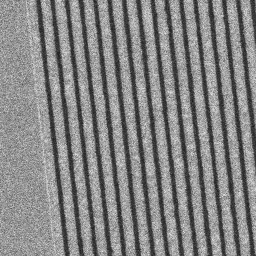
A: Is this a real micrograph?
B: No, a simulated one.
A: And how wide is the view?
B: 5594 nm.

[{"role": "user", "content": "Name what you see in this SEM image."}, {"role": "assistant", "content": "parallel lines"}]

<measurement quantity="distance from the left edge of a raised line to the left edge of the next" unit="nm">310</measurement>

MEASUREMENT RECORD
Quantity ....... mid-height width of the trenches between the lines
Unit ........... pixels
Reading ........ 4.59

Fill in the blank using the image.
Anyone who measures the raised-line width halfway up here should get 220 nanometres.